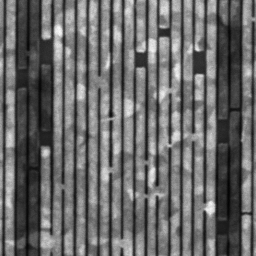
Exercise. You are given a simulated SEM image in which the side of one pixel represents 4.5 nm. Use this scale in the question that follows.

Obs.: parallel lines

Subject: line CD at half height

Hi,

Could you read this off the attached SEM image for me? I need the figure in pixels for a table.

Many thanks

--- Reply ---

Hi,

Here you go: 9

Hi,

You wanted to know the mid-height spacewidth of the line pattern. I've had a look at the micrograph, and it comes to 12.4 nanometers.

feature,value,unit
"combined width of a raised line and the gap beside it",53.2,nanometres